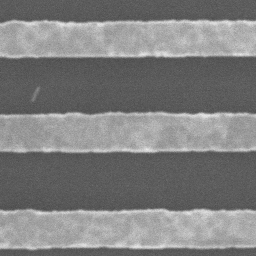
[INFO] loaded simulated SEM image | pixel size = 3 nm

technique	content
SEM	lines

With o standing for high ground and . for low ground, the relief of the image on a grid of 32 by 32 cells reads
................................
................................
................................
oooooooooooooooooooooooooooooooo
oooooooooooooooooooooooooooooooo
oooooooooooooooooooooooooooooooo
oooooooooooooooooooooooooooooooo
................................
................................
................................
................................
................................
................................
................................
oooooooooooooooooooooooooooooooo
oooooooooooooooooooooooooooooooo
oooooooooooooooooooooooooooooooo
oooooooooooooooooooooooooooooooo
oooooooooooooooooooooooooooooooo
................................
................................
................................
................................
................................
................................
................................
ooooo.oooooooooooooooooooooooooo
oooooooooooooooooooooooooooooooo
oooooooooooooooooooooooooooooooo
oooooooooooooooooooooooooooooooo
oooooooooooooooooooooooooooooooo
................................